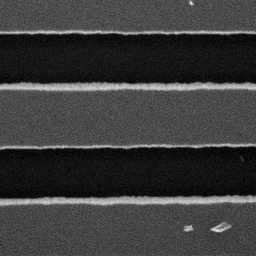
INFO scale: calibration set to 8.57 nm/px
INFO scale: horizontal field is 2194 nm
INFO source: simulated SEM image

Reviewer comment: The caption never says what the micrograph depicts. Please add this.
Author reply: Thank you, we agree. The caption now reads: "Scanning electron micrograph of lines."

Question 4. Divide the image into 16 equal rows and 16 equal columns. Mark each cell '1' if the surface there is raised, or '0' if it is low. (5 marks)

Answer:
1111111111111111
1111111111111111
0000000000000000
0000000000000000
0000000000000000
1111111111111111
1111111111111111
1111111111111111
1111111111111111
0000000000000000
0000000000000000
0000000000000000
0000110111111111
1111111111111111
1111111111111111
1111111111111111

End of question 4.